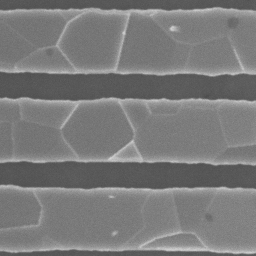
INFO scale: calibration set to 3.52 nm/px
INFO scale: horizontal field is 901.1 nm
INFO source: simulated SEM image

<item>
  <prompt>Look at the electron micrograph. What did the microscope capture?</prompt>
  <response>lines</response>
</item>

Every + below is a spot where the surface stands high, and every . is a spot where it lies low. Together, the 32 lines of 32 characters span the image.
................................
++++++++++++++++++++++++++++++++
++++++++++++++++++++++++++++++++
++++++++++++++++++++++++++++++++
++++++++++++++++++++++++++++++++
++++++++++++++++++++++++++++++++
++++++++++++++++++++++++++++++++
++++++++++++++++++++++++++++++++
++++++++++++++++++++++++++++++++
................................
................................
................................
++++++.....++++++++++.++++.++...
++++++++++++++++++++++++++++++++
++++++++++++++++++++++++++++++++
++++++++++++++++++++++++++++++++
++++++++++++++++++++++++++++++++
++++++++++++++++++++++++++++++++
++++++++++++++++++++++++++++++++
++++++++++++++++++++++++++++++++
..........................++...+
................................
................................
+++........................+....
++++++++++++++++++++++++++++++++
++++++++++++++++++++++++++++++++
++++++++++++++++++++++++++++++++
++++++++++++++++++++++++++++++++
++++++++++++++++++++++++++++++++
++++++++++++++++++++++++++++++++
++++++++++++++++++++++++++++++++
.++........................+++++